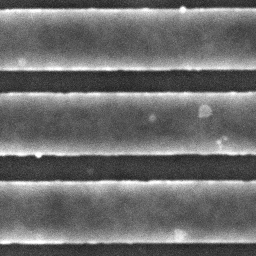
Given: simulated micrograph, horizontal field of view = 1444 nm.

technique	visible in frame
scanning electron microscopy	lines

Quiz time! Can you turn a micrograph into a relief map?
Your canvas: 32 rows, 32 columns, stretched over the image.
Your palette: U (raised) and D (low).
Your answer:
DDDDDDDDDDDDDDDDDDDDDDDDDDDDDDDD
UUUUUUUUUUUUUUUUUUUUUUUUUUUUUUUU
UUUUUUUUUUUUUUUUUUUUUUUUUUUUUUUU
UUUUUUUUUUUUUUUUUUUUUUUUUUUUUUUU
UUUUUUUUUUUUUUUUUUUUUUUUUUUUUUUU
UUUUUUUUUUUUUUUUUUUUUUUUUUUUUUUU
UUUUUUUUUUUUUUUUUUUUUUUUUUUUUUUU
UUUUUUUUUUUUUUUUUUUUUUUUUUUUUUUU
UUUUUUUUUUUUUUUUUUUUUUUUUUUUUUUU
DDDDDDDDDDDDDDDDDDDDDDDDDDDDDDDD
DDDDDDDDDDDDDDDDDDDDDDDDDDDDDDDD
DDDDDDDDDDDDDDDDDDDDDDDDDDDDDDDD
UUUUUUUUUUUUUUUUUUUUUUUUUUUUUUUU
UUUUUUUUUUUUUUUUUUUUUUUUUUUUUUUU
UUUUUUUUUUUUUUUUUUUUUUUUUUUUUUUU
UUUUUUUUUUUUUUUUUUUUUUUUUUUUUUUU
UUUUUUUUUUUUUUUUUUUUUUUUUUUUUUUU
UUUUUUUUUUUUUUUUUUUUUUUUUUUUUUUU
UUUUUUUUUUUUUUUUUUUUUUUUUUUUUUUU
DDDDDDDDDDDDDDDDDDDDDDDDDDDDDDDD
DDDDDDDDDDDDDDDDDDDDDDDDDDDDDDDD
DDDDDDDDDDDDDDDDDDDDDDDDDDDDDDDD
DDDDDDDDDDDDDDDDDDDDDDDDDDDDDDDD
UUUUUUUUUUUUUUUUUUUUUUUUUUUUUUUU
UUUUUUUUUUUUUUUUUUUUUUUUUUUUUUUU
UUUUUUUUUUUUUUUUUUUUUUUUUUUUUUUU
UUUUUUUUUUUUUUUUUUUUUUUUUUUUUUUU
UUUUUUUUUUUUUUUUUUUUUUUUUUUUUUUU
UUUUUUUUUUUUUUUUUUUUUUUUUUUUUUUU
UUUUUUUUUUUUUUUUUUUUUUUUUUUUUUUU
DDDDDDDDDDDDDDDDDDDDDDDDDDDDDDDD
DDDDDDDDDDDDDDDDDDDDDDDDDDDDDDDD